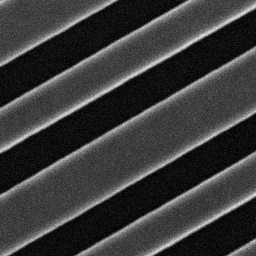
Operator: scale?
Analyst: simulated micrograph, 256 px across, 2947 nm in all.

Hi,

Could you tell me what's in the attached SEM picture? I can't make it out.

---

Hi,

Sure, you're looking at lines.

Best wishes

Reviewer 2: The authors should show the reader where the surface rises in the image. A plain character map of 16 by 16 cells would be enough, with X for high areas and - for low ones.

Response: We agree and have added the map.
XXXXXX-----XXXXX
XXXXX----XXXXX--
XXX----XXXXX----
X-----XXXXX----X
----XXXXX----XXX
--XXXXX-----XXXX
XXXXX-----XXXXXX
XXXX----XXXXXXX-
XX----XXXXXXX---
-----XXXXXXX----
---XXXXXXX----XX
-XXXXXXX-----XXX
XXXXXXX----XXXXX
XXXXX----XXXXX--
XXX----XXXXX----
X-----XXXX-----X